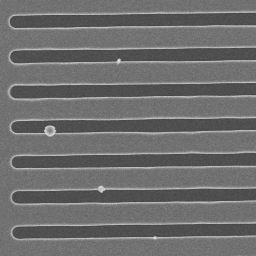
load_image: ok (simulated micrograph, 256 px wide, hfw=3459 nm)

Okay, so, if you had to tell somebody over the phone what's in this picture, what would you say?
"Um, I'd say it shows groups of lines, slits or small figures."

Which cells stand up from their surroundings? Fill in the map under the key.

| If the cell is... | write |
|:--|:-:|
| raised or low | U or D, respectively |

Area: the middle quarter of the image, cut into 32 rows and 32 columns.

UUUUUUUUUUUUUUUUUUUUUUUUUUUUUUUU
UUUUUUUUUUUUUUUUUUUUUUUUUUUUUUUU
UUUUUUUUUUUUUUUUUUUUUUUUUUUUUUUU
UUUUUUUUUUUUUUUUUUUUUUUUUUUUUUUU
UUUUUUUUUUUUUUUUUUUUUUUUUUUUUUUU
DDDDDDDDDDDDDDDDDDDDDDDDDDDDDDDD
DDDDDDDDDDDDDDDDDDDDDDDDDDDDDDDD
DDDDDDDDDDDDDDDDDDDDDDDDDDDDDDDD
DDDDDDDDDDUUUUUUUUUUUUUUUUUUUUUU
UUUUUUUUUUUUUUUUUUUUUUUUUUUUUUUU
UUUUUUUUUUUUUUUUUUUUUUUUUUUUUUUU
UUUUUUUUUUUUUUUUUUUUUUUUUUUUUUUU
UUUUUUUUUUUUUUUUUUUUUUUUUUUUUUUU
UUUUUUUUUUUUUUUUUUUUUUDDDDDDDDDD
DDDDDDDDDDDDDDDDDDDDDDDDDDDDDDDD
DDDDDDDDDDDDDDDDDDDDDDDDDDDDDDDD
DDDDDDDDDDDDDDDDDDDDDDDDDDDDDDDD
UUUUUUUUUUUUUUUUUUUUUUUUUUUUUUUU
UUUUUUUUUUUUUUUUUUUUUUUUUUUUUUUU
UUUUUUUUUUUUUUUUUUUUUUUUUUUUUUUU
UUUUUUUUUUUUUUUUUUUUUUUUUUUUUUUU
UUUUUUUUUUUUUUUUUUUUUUUUUUUUUUUU
UUUUUUUUUUUUUUUUUUUUUUUUUUUDDDDD
DDDDDDDDDDDDDDDDDDDDDDDDDDDDDDDD
DDDDDDDDDDDDDDDDDDDDDDDDDDDDDDDD
DDDDDDDDDDDDDDDDDDDDDDDDDDDDDDDD
UUUUUUUUUUUUUUUUUUUUUUUUUUUUUUUU
UUUUUUUUUUUUUUUUUUUUUUUUUUUUUUUU
UUUUUUUUUUUUUUUUUUUUUUUUUUUUUUUU
UUUUUUUUUUUUUUUUUUUUUUUUUUUUUUUU
UUUUUUUUUUUUUUUUUUUUUUUUUUUUUUUU
UUUUUUUDUUDDDDDDDDDDDDDDDDDDDDDD